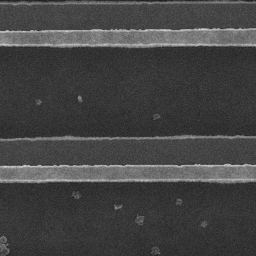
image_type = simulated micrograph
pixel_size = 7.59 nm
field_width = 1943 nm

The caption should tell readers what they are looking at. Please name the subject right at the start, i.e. lines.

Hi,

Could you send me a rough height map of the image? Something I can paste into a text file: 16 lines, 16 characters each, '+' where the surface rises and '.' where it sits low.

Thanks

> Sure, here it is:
++++++++++++++++
++++++++++++++++
++++++++++++++++
................
................
................
................
................
................
++++++++++++++++
++++++++++++++++
................
................
................
................
................